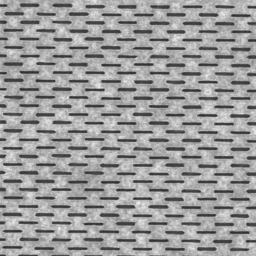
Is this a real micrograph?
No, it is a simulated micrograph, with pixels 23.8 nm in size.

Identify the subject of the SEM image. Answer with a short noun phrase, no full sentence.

a regular array of holes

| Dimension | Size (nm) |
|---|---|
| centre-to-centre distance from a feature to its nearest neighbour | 393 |